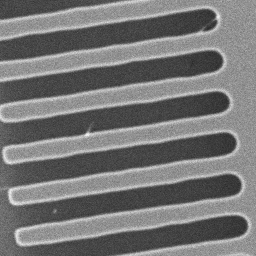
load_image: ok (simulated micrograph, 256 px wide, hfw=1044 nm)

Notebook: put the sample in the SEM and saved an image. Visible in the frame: groups of lines, slits or small figures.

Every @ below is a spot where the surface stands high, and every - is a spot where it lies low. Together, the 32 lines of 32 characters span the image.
-------------@@@@@@@@@@@@@@@@@@@
-------@@@@@@@@@@@@@@@@----@@@@@
-@@@@@@@@@@@@@@@@----------@@@@@
@@@@@@@@@@-----------------@@@@@
@@@--------------------@@@@@@@@@
----------------@@@@@@@@@@@@@@@@
---------@@@@@@@@@@@@@@@---@@@@@
--@@@@@@@@@@@@@@@-----------@@@@
@@@@@@@@@@@-----------------@@@@
@@@@@-------------------@@@@@@@@
-----------------@@@@@@@@@@@@@@@
-----------@@@@@@@@@@@@@@@--@@@@
----@@@@@@@@@@@@@@@@---------@@@
@@@@@@@@@@@@@---------------@@@@
@@@@@@@-------------------@@@@@@
-------------------@@@@@@@@@@@@@
------------@@@@@@@@@@@@@@@@@@@@
------@@@@@@@@@@@@@@@---------@@
-@@@@@@@@@@@@@@--------------@@@
@@@@@@@@--------------------@@@@
---------------------@@@@@@@@@@@
--------------@@@@@@@@@@@@@@@@@@
--------@@@@@@@@@@@@@@@-------@@
--@@@@@@@@@@@@@@@-------------@@
-@@@@@@@@@-------------------@@@
--@@-------------------@@@@@@@@@
----------------@@@@@@@@@@@@@@@@
---------@@@@@@@@@@@@@@@@------@
---@@@@@@@@@@@@@@@@------------@
--@@@@@@@@@@------------------@@
--@@@-------------------@@@@@@@@
------------------@@@@@@@@@@@@@@